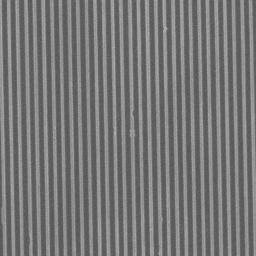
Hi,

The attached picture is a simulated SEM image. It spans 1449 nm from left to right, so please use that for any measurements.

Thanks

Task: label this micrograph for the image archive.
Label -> parallel lines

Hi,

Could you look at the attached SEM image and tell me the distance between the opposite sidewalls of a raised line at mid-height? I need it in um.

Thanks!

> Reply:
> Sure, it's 0.0184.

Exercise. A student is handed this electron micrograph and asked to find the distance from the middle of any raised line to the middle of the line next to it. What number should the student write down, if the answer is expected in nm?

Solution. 48.9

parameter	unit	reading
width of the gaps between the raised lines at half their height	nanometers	32.5